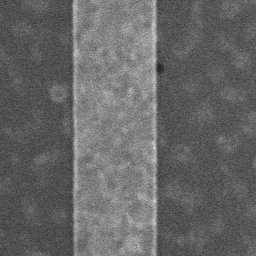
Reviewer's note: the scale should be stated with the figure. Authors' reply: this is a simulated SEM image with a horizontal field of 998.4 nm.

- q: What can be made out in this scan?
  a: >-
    one or a few lines or trenches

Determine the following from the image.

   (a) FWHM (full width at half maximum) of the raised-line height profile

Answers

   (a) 0.313 micrometres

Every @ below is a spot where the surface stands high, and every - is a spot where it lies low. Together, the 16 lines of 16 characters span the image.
-----@@@@@------
-----@@@@@------
-----@@@@@------
-----@@@@@------
-----@@@@@------
-----@@@@@------
-----@@@@@------
-----@@@@@------
-----@@@@@------
-----@@@@@------
-----@@@@@------
-----@@@@@------
-----@@@@@------
-----@@@@@------
-----@@@@@------
-----@@@@@------